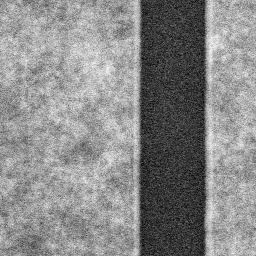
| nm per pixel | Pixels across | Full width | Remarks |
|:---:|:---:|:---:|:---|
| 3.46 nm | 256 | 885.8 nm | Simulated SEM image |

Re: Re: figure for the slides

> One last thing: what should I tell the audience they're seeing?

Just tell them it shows one or a few lines or trenches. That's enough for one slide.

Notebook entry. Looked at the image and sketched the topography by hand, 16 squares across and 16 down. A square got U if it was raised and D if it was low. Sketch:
UUUUUUUUUDDDDUUU
UUUUUUUUUDDDDUUU
UUUUUUUUUDDDDUUU
UUUUUUUUUDDDDUUU
UUUUUUUUUDDDDUUU
UUUUUUUUUDDDDUUU
UUUUUUUUUDDDDUUU
UUUUUUUUUDDDDUUU
UUUUUUUUUDDDDUUU
UUUUUUUUUDDDDUUU
UUUUUUUUUDDDDUUU
UUUUUUUUUDDDDUUU
UUUUUUUUUDDDDUUU
UUUUUUUUUDDDDUUU
UUUUUUUUUDDDDUUU
UUUUUUUUUDDDDUUU